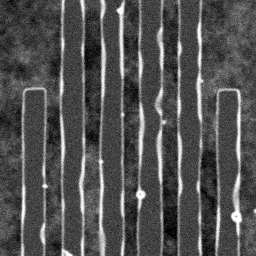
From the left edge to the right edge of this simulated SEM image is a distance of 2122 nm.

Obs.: groups of lines, slits or small figures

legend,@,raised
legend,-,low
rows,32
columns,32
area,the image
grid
--------@@---@@--@@@--@@@-------
--------@@---@@---@@--@@@-------
--------@@@--@@---@@--@@@-------
--------@@@--@@---@@--@@@-------
--------@@@--@@--@@@--@@@-------
--------@@---@@--@@@--@@@-------
--------@@---@@--@@@--@@@-------
--------@@---@@---@@--@@@-------
--------@@---@@---@@--@@@-------
--------@@---@@---@@--@@@-------
--------@@---@@--@@@--@@@-------
---@@@--@@---@@---@@--@@@--@@@--
---@@@--@@@--@@---@@--@@@--@@@--
---@@@--@@@--@@---@@--@@@--@@@--
---@@@--@@@--@@---@@--@@@--@@@--
---@@@--@@@--@@---@@--@@@--@@@--
---@@@--@@@--@@---@@--@@@--@@@--
---@@@--@@@--@@---@@--@@@--@@@--
---@@@--@@@--@@---@@--@@@--@@@--
---@@@--@@@--@@---@@--@@@--@@@--
---@@@--@@--@@@--@@@--@@@--@@@--
---@@---@@---@@--@@@--@@@--@@@--
---@@@--@@---@@--@@@--@@@--@@@--
---@@@--@@---@@--@@@--@@@--@@@--
---@@@--@@---@@--@@@--@@@--@@---
---@@@--@@---@@--@@@--@@@--@@@--
---@@@--@@---@@--@@@--@@@--@@@--
---@@@--@@---@@--@@@--@@@--@@@--
---@@---@@---@@--@@@--@@@--@@@--
---@@---@@---@@--@@@--@@@--@@@--
---@@---@@---@@--@@@--@@@--@@@--
---@@---@@---@@--@@@--@@@--@@@--